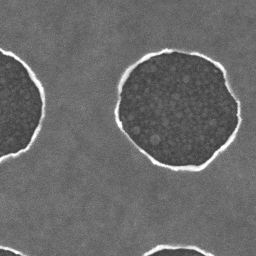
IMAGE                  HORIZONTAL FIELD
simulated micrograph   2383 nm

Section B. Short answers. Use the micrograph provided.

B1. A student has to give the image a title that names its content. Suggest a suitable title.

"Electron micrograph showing holes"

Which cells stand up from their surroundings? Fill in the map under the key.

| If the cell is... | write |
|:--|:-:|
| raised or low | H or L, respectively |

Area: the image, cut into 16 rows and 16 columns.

HHHHHHHHHHHHHHHH
HHHHHHHHHHHHHHHH
HHHHHHHHHHHHHHHH
LHHHHHHHHHLLHHHH
LLHHHHHHLLLLLLHH
LLHHHHHHLLLLLLHH
LLLHHHHLLLLLLLLH
LLLHHHHLLLLLLLLH
LLHHHHHHLLLLLLHH
LHHHHHHHHLLLLLHH
HHHHHHHHHHHHHHHH
HHHHHHHHHHHHHHHH
HHHHHHHHHHHHHHHH
HHHHHHHHHHHHHHHH
HHHHHHHHHHHHHHHH
HHHHHHHHHHHHHHHH